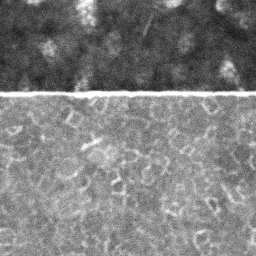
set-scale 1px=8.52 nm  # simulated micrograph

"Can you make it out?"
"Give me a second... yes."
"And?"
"one or a few lines or trenches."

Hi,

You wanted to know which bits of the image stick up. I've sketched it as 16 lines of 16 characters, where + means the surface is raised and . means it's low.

................
................
................
................
................
................
++++++++++++++++
++++++++++++++++
++++++++++++++++
++++++++++++++++
++++++++++++++++
++++++++++++++++
++++++++++++++++
++++++++++++++++
++++++++++++++++
++++++++++++++++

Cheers